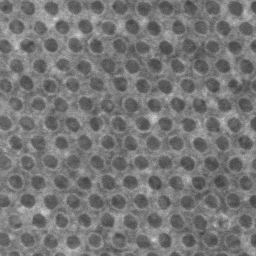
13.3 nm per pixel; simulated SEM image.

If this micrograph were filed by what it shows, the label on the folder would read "a regular array of raised bodies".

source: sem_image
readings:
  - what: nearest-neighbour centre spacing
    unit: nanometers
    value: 286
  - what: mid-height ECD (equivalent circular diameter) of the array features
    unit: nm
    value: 219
